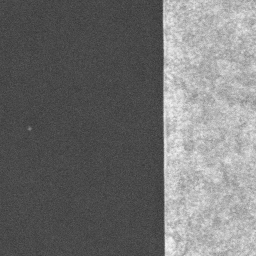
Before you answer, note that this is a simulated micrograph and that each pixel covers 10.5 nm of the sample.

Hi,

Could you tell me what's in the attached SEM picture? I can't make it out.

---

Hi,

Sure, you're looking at wiring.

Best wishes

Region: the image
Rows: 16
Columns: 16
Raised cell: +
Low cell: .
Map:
..........++++++
..........++++++
..........++++++
..........++++++
..........++++++
..........++++++
..........++++++
..........++++++
..........++++++
..........++++++
..........++++++
..........++++++
..........++++++
..........++++++
..........++++++
..........++++++